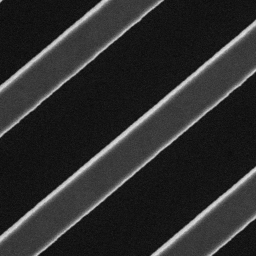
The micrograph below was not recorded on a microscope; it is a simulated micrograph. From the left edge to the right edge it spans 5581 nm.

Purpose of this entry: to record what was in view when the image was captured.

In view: lines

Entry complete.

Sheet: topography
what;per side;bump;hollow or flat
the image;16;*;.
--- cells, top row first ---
......****......
.....***........
....***........*
..****.......***
.****.......****
****.......****.
**........****..
*........***....
........***.....
......****......
.....****.......
....****.......*
...***........**
..***.......****
****.......****.
***.......****..